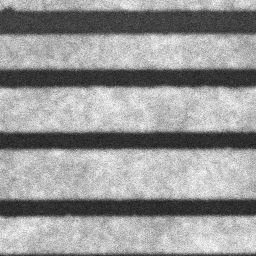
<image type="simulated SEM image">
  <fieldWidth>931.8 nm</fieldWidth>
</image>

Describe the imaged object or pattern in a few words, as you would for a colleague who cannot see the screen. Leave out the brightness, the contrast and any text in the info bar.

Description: one or a few lines or trenches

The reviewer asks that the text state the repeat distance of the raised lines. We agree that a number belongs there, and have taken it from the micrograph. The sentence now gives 223 nm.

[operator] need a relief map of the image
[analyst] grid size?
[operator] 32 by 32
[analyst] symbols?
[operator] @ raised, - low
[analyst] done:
@@@@@@@@@@@@@@@@@@@@@@@@@@@@@@@@
--------------------------------
--------------------------------
--------------------------------
@@@@@@@@@@@@@@@@@@@@@@@@@@@@@@@@
@@@@@@@@@@@@@@@@@@@@@@@@@@@@@@@@
@@@@@@@@@@@@@@@@@@@@@@@@@@@@@@@@
@@@@@@@@@@@@@@@@@@@@@@@@@@@@@@@@
@@@@@@@@@@@@@@@@@@@@@@@@@@@@@@@@
--------------------------------
--------------------------------
@@@@@@@@@@@@@@@@@@@@@@@@@@@@@@@@
@@@@@@@@@@@@@@@@@@@@@@@@@@@@@@@@
@@@@@@@@@@@@@@@@@@@@@@@@@@@@@@@@
@@@@@@@@@@@@@@@@@@@@@@@@@@@@@@@@
@@@@@@@@@@@@@@@@@@@@@@@@@@@@@@@@
@@@@----@@@-----@@@-----@--@--@@
--------------------------------
----------------------------@---
@@@@@@@@@@@@@@@@@@@@@@@@@@@@@@@@
@@@@@@@@@@@@@@@@@@@@@@@@@@@@@@@@
@@@@@@@@@@@@@@@@@@@@@@@@@@@@@@@@
@@@@@@@@@@@@@@@@@@@@@@@@@@@@@@@@
@@@@@@@@@@@@@@@@@@@@@@@@@@@@@@@@
@@@@@@@@@@@@@@@@@@@@@@@@@@@@@@@@
--------------------------------
--------------------------------
@@@@@@@@@@@@@@@@@@@@@@@@@@@@@@@@
@@@@@@@@@@@@@@@@@@@@@@@@@@@@@@@@
@@@@@@@@@@@@@@@@@@@@@@@@@@@@@@@@
@@@@@@@@@@@@@@@@@@@@@@@@@@@@@@@@
@@@@@@@@@@@@@@@@@@@@@@@@@@@@@@@@